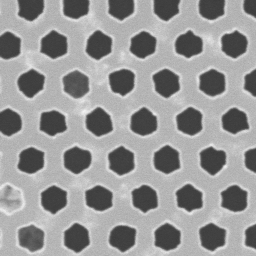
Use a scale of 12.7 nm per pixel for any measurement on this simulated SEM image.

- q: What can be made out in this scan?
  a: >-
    a regular array of holes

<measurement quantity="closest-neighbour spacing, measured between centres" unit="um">0.562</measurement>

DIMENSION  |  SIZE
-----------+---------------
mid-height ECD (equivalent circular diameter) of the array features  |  344 nm